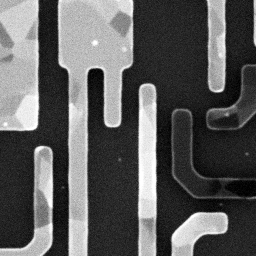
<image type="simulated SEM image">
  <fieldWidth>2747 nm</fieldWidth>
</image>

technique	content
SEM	wiring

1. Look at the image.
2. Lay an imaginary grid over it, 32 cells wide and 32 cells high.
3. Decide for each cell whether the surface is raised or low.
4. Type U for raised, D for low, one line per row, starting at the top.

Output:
UUUUUDDUUUUUUUUUUDDDDDDDDDUUDDDD
UUUUUDDUUUUUUUUUUDDDDDDDDDUUDDDD
UUUUUDDUUUUUUUUUUDDDDDDDDDUUDDDD
UUUUUDDUUUUUUUUUUDDDDDDDDDUUDDDD
UUUUUDDUUUUUUUUUUDDDDDDDDDUUDDDD
UUUUUDDUUUUUUUUUUDDDDDDDDDUUDDDD
UUUUUDDUUUUUUUUUUDDDDDDDDDUUDDDD
UUUUUDDUUUUUUUUUUDDDDDDDDDUUDDDD
UUUUUDDDUUUUUUUUDDDDDDDDDDUUDDUU
UUUUUDDDDUUDDUUDDDDDDDDDDDUUDDUU
UUUUUDDDDUUDDUUDDDDDDDDDDDUUDDUU
UUUUUDDDDUUDDUUDDUUDDDDDDDDDDDUU
UUUUUDDDDUUDDUUDDUUDDDDDDDDDDDUU
UUUUUDDDDUUDDUUDDUUDDDDDDDDDUUUU
UUUUUDDDDUUDDUUDDUUDDDUUDDUUUUUU
UUUUUDDDDUUDDUUDDUUDDDUUDDUUUUUD
DDDDDDDDDUUDDDDDDUUDDDUUDDDDDDDD
DDDDDDDDDUUDDDDDDUUDDDUUDDDDDDDD
DDDDDUDDDUUDDDDDDUUDDDUUDDDDDDDD
DDDDUUDDDUUDDDDDDUUDDDUUDDDDDDDD
DDDDUUDDDUUDDDDDDUUDDDUUDDDDDDDD
DDDDUUDDDUUDDDDDDUUDDDUUDDDDDDDD
DDDDUUDDDUUDDDDDDUUDDDUUUUUUUUUU
DDDDUUDDDUUDDDDDDUUDDDDUUUUUUUUU
DDDDUUDDDUUDDDDDDUUDDDDDUUUUUUUU
DDDDUUDDDUUDDDDDDUUDDDDDDDDDDDDD
DDDDUUDDDUUDDDDDDUUDDDDDDDDDDDDD
DDDDUUDDDUUDDDDDDUUDDDDUUUUUDDDD
DDDDUUDDDUUDDDDDDUUDDDUUUUUUDDDD
DDDDUUDDDUUDDDDDDUUDDDUUUDDDDDDD
DDDDUUDDDUUDDDDDDUUDDDUUDDDDDDDD
UUUUUUDDDUUDDDDDDUUDDDUUDDDDDDDD